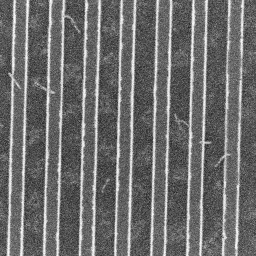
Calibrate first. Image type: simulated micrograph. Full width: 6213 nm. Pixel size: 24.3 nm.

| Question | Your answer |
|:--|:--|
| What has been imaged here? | parallel lines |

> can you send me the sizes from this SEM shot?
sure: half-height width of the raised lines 334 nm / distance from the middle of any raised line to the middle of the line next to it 869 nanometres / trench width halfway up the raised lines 549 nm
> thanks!